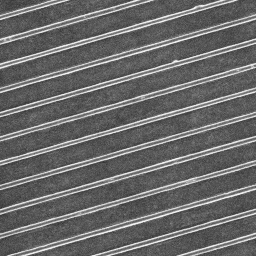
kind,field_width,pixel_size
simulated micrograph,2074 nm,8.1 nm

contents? parallel lines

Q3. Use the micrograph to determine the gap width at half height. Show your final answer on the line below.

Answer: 153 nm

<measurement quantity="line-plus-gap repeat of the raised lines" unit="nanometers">189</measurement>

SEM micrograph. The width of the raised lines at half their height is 37.9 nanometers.